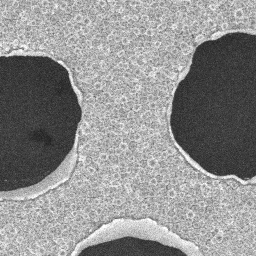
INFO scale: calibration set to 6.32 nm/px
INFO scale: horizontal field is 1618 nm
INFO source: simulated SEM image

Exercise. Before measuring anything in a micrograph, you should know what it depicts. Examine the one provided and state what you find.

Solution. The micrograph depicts holes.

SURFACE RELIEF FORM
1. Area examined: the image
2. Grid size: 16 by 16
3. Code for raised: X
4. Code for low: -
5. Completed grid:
XXXXXXXXXXXXXXXX
XXXXXXXXXXXXXXXX
XXXXXXXXXXXXX---
X-XXXXXXXXXX----
----XXXXXXXX----
-----XXXXXX-----
-----XXXXXX-----
-----XXXXXX-----
-----XXXXXX-----
-----XXXXXXX----
----XXXXXXXXX---
---XXXXXXXXXXXXX
XXXXXXXXXXXXXXXX
XXXXXXXXXXXXXXXX
XXXXXXX--XXXXXXX
XXXXX------XXXXX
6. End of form